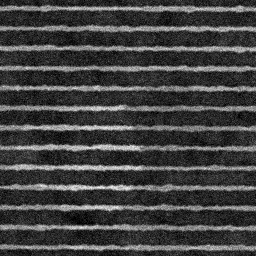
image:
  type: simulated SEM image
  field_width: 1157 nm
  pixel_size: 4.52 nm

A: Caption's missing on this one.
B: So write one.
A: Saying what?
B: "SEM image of parallel lines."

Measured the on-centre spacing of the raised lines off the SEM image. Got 89.9 nm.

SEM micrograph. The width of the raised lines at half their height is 16.4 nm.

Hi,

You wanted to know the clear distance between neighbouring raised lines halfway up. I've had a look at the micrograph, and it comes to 74.6 nm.